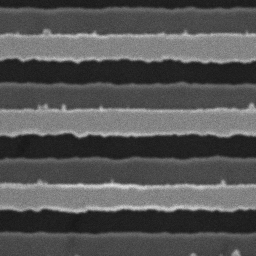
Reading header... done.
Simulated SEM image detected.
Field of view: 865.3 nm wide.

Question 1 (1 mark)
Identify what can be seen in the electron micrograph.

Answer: lines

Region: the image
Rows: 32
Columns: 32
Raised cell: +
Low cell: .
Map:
................................
++++++++++++++++++++++++++++++++
++++++++++++++++++++++++++++++++
++++++++++++++++++++++++++++++++
++++++++++++++++++++++++++++++++
++++++++++++++++++++++++++++++++
++++++++++++++++++++++++++++++++
......++.++.+.....++..++++++++++
................................
................................
+++++++++..+++..+..+++++++....++
++++++++++++++++++++++++++++++++
++++++++++++++++++++++++++++++++
++++++++++++++++++++++++++++++++
++++++++++++++++++++++++++++++++
++++++++++++++++++++++++++++++++
++++++++++++++++++++++++++++++++
................................
................................
................................
++++++++++++++++++++++++++++++++
++++++++++++++++++++++++++++++++
++++++++++++++++++++++++++++++++
++++++++++++++++++++++++++++++++
++++++++++++++++++++++++++++++++
++++++++++++++++++++++++++++++++
.........+......................
................................
................................
++++++++++++++++++++++++++++++++
++++++++++++++++++++++++++++++++
++++++++++++++++++++++++++++++++